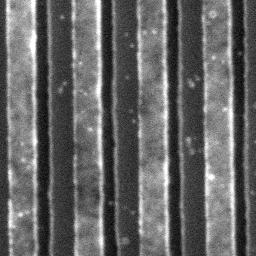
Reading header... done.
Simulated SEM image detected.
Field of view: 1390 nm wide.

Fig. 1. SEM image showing lines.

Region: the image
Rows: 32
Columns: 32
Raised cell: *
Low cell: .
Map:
.***.....***.....****....****...
.***.....***.....****....****...
.***.....***.....****....****...
.***.....***.....****....****...
.***.....***.....****....****...
.***.....***.....****....****...
.***.....***.....****....****...
.***.....****....****....****...
.***.....****....****.....***...
.***.....****....****.....***...
.***.....****.....***.....***...
.***.....***......***.....***...
.***.....***.....****.....***...
.***.....****....****.....***...
.***.....****....****.....***...
.***.....****.....***.....***...
.***.....****....****.....***...
.***.....****.....***.....***...
.***.....****.....***.....***...
.***.....****.....***.....***...
.***.....****.....***.....***...
.***.....****.....***.....***...
.***.....****.....***.....***...
.***.....****.....***.....***...
.***.....****.....***.....***...
.***.....****.....***.....***...
.***.....****.....***.....***...
.***.....****.....***.....***...
.***.....****.....***.....***...
.***.....****.....***.....***...
.****....****.....***.....***...
.***.....****.....***.....***...